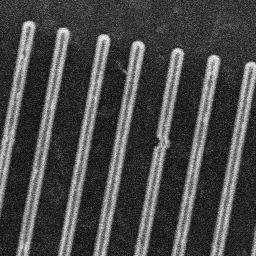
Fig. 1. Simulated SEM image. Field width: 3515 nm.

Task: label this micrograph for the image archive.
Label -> parallel lines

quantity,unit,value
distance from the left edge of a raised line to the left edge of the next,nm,519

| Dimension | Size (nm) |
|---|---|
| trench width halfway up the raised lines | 395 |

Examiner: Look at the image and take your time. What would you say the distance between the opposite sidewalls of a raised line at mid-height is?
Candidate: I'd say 132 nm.